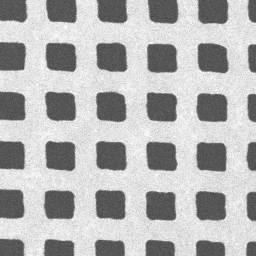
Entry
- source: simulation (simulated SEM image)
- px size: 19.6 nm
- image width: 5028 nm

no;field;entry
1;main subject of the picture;a regular array of holes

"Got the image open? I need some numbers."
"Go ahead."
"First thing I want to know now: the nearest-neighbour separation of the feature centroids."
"965 nm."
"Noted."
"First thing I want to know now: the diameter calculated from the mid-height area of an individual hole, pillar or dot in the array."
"638 nanometers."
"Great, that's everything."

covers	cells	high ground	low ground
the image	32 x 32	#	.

...###....##....###...###....##.
...###....##....###...###....##.
...###...###....###...###...###.
################################
################################
...###...###...####.#####..#####
...###...###....##....###...###.
...###...###....##....###...###.
...###...###....##....###....##.
################################
################################
.#####.######.##################
...###...###....##....###...###.
...###....##....##....###...###.
...###...###....##....###....##.
################################
################################
################################
...###...###....##....###...###.
...###...###....##....###...###.
...###...###....##....###...###.
###########################.####
################################
################################
...###...###....##....##....###.
...##....###....##....##....###.
...###...###....##....###...###.
####################..###...###.
################################
################################
...###...###...###....###...###.
...##....###....##....###...###.